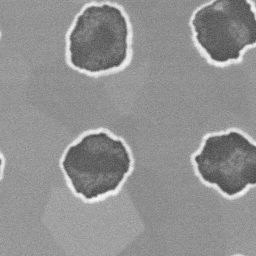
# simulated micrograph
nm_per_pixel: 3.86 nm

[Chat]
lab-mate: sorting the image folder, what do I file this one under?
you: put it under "holes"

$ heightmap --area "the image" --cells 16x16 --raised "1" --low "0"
1111100111111000
1111100011110000
1111000011110000
1111000011111001
1111101111111111
1111111111111111
1111111111111111
1111111111111111
1111100111111001
1111000011110000
1111000011110000
1111000111111000
1111111111111111
1111111111111111
1111111111111111
1111111111111111